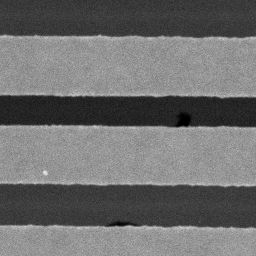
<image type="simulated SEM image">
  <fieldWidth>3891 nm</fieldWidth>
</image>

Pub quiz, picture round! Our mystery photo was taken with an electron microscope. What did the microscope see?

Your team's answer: lines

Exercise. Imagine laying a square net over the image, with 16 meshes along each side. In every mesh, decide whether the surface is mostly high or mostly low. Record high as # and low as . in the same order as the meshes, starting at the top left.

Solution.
................
................
################
################
################
################
................
................
################
################
################
......#.########
................
................
################
################